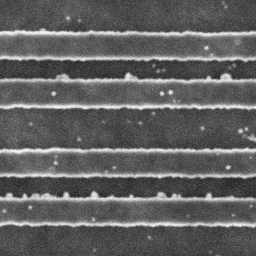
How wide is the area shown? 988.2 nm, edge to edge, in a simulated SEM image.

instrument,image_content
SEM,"lines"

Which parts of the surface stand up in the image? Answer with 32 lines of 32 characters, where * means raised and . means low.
................................
................................
................................
................................
********************************
********************************
********************************
.......*.**......**...**.*.*..**
................................
................................
********************************
********************************
********************************
*......*..*..**.**.......**.*.**
................................
................................
................................
................................
................................
********************************
********************************
********************************
................................
................................
................................
********************************
********************************
********************************
................................
................................
................................
................................